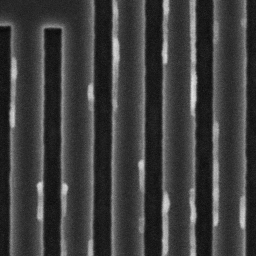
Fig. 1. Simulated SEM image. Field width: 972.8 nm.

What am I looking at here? parallel lines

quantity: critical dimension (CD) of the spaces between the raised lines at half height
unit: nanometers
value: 73.2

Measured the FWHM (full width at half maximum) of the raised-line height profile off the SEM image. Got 121 nm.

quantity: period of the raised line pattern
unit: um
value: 0.192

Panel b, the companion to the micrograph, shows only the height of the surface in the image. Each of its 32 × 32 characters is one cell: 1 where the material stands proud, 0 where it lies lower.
11111111111100111100111100011110
11111111111100111100111100011110
11111111111100111100111100011110
01111100111100111100111100011110
01111000111100111100011100011110
01111000111100111100111100011110
01111000111100111100111100011110
01111000111100111100111100011110
01111000111100111100111100011110
01111000111100111100111110011110
01111000111100111100011110011110
01111000111100111100111100011110
01111000111100111100111100011110
01111000111100111100111100011110
01111000111100111100111100011110
01111000111100111100111100011110
01111000111100111100111100011110
01111000111100111100111100011110
01111000111100111100111100011110
01111000111100111100111100011110
01111000111100111100111100011110
01111000111100111100111100011110
01111000111100111100111100011110
01111000111100111100111100011110
01111000111100111100111100011110
01111000111100111100111100011110
01111000111100111100111110011110
01111000111100111100111100011110
01111000111100111100111100011110
01111000111100111100111100011110
01111000111100111100111100011110
01111000111100111100111100011110